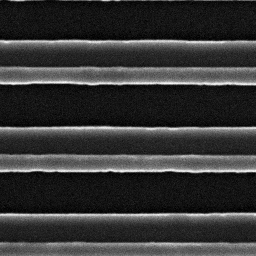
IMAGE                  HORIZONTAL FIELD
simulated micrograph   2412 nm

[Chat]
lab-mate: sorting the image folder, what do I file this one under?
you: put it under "lines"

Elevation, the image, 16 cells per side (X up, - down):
----------------
----------------
----------------
XXXXXXXXXXXXXXXX
XXXXXXXXXXXXXXXX
----------------
----------------
----------------
XXXXXXXXXXXXXXXX
XXXXXXXXXXXXXXXX
XXXXXXXXXXXXXXXX
----------------
----------------
XXXXXXXXXXXXXXXX
XXXXXXXXXXXXXXXX
XXXXXXXXXXXXXXXX